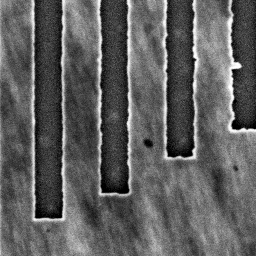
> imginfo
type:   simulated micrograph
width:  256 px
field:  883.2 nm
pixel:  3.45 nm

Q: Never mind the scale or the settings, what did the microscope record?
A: one or a few lines or trenches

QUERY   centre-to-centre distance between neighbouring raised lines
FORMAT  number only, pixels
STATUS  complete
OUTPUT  66.1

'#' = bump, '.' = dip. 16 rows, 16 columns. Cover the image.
##..##..##..##..
##..##..##..##..
##..##..##..##..
##..##..##..###.
##..##..##..###.
##..##..##..##..
##..##..##..###.
##..##..##..###.
##..##..##..####
##..##..##..####
##..##..########
##..##..########
##..############
##..############
################
################